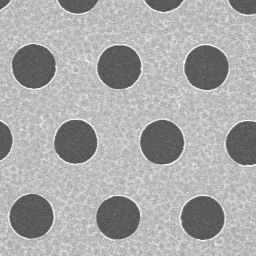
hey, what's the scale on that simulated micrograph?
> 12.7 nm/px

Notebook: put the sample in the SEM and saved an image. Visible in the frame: a regular array of holes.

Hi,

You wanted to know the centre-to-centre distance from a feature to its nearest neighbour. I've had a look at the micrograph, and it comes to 1090 nm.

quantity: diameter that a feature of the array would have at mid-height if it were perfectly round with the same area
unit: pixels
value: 44.3